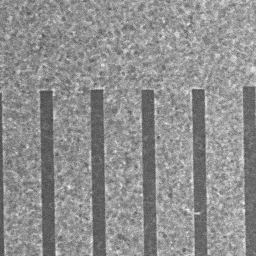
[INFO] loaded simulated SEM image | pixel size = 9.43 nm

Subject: parallel lines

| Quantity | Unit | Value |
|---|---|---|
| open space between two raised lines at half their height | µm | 0.13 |